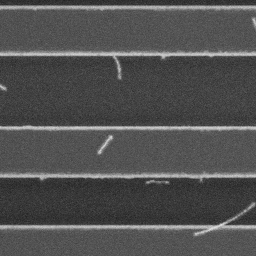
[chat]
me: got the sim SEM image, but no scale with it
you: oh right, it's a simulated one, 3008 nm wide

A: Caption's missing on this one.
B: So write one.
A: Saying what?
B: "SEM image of lines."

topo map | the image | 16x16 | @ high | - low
@@@@@@@@@@@@@@@@
@@@@@@@@@@@@@@@@
@@@@@@@@@@@@@@@@
----------@-----
----------------
----------------
----------------
----------------
@@@@@@@@@@@@@@@@
@@@@@@@@@@@@@@@@
@@@@@@@@@@@@@@@@
----------------
----------------
----------------
@@@@@@@@@@@@@@@@
@@@@@@@@@@@@@@@@